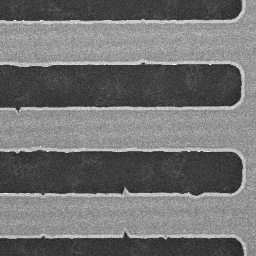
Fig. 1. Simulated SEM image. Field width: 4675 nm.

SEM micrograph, one or a few lines or trenches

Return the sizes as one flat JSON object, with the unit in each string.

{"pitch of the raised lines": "1580 nm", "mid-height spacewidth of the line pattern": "817 nm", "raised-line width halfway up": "767 nm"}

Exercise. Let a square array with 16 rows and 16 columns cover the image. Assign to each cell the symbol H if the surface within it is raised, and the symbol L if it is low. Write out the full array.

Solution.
LLLLLLLLLLLLLLLH
HHHHHHHHHHHHHHHH
HHHHHHHHHHHHHHHH
HHHHHHHHHHHHHHHH
LLLLLLLLLLLLLLLH
LLLLLLLLLLLLLLLH
LLLLLLLLLLLLLLLH
HHHHHHHHHHHHHHHH
HHHHHHHHHHHHHHHH
LLLLLLLLLLLLLLLH
LLLLLLLLLLLLLLLH
LLLLLLLLLLLLLLLH
HHHHHHHHHHHHHHHH
HHHHHHHHHHHHHHHH
HHHHHHHHHHHHHHHH
LLLLLLLLLLLLLLLH